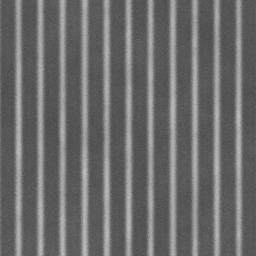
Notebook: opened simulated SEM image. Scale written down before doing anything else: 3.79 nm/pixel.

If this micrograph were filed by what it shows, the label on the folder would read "parallel lines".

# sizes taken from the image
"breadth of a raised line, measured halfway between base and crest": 4.75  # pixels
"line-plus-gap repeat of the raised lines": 83.4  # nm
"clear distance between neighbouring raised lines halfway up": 64.8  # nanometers